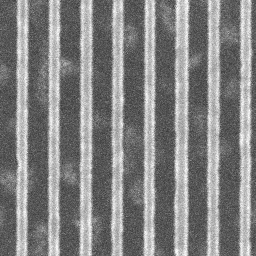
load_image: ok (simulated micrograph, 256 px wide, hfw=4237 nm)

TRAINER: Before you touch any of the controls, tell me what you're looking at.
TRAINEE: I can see parallel lines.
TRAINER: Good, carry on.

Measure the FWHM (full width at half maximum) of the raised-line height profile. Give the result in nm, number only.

145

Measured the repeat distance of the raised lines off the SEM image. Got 528 nanometers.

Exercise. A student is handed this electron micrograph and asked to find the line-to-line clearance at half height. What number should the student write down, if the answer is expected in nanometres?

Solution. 387